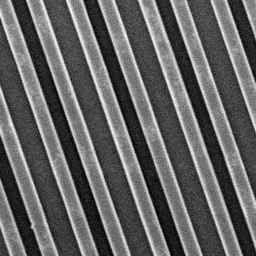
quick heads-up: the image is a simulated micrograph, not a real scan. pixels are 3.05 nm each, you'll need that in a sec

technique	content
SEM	parallel lines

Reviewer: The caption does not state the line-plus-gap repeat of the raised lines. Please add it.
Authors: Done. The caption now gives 0.104 microns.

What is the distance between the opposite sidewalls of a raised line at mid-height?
46.9 nm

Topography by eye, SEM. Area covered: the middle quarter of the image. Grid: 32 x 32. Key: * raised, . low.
......****....****......****....
*......****....****......****...
*......****....****......****...
*......****....****......****...
**......****....****......****..
**......****....****......****..
**......****....****......****..
***......****....****......****.
***......****....****......****.
***......****....****......*****
****......****....****......****
****......****....****......****
****......****....****......****
.****......****....****......***
.****......****....****......***
.*****.....*****...****.......**
..****......****....****......**
..****......****....****......**
..*****.....*****...****.......*
...****......****....****......*
...****......****....****......*
...****.......****...****.......
....****......****....****......
....****......****....****......
*...****.......****...****......
*....****......****....****.....
*....****......****....****.....
**...****.......****...*****....
**....****......****....****....
**....****......****....****....
***...****.......****....****...
***....****......****....****...